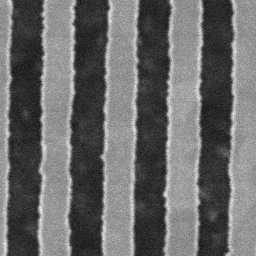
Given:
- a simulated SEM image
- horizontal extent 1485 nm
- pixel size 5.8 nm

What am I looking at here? one or a few lines or trenches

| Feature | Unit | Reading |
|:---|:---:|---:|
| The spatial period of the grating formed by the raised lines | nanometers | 369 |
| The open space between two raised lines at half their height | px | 33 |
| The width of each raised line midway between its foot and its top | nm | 173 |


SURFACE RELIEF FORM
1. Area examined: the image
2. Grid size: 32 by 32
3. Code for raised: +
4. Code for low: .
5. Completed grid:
+....++++.....+++....++++....+++
+....++++.....+++....++++....+++
+.....+++.....+++....++++....+++
+.....+++.....+++....++++....+++
+....++++.....+++....++++....+++
+....++++.....+++....++++....+++
+.....+++....++++....++++....+++
+....++++....++++....++++....+++
+....++++....++++....++++....+++
+....++++....++++....++++....+++
+....++++....++++....++++....+++
+....++++....++++....++++....+++
+....++++....++++....++++....+++
+....++++....++++....++++....+++
+....++++....++++....++++....+++
+....++++....++++....++++....+++
+....++++....++++....++++....+++
+....++++....++++....++++....+++
+....++++....++++....++++....+++
+....++++....++++....++++....+++
+....++++....++++....++++....+++
+....++++....++++....++++....+++
+....++++....++++....++++....+++
+....++++....++++....++++....+++
+....++++....++++....++++....+++
+....++++....++++....++++....+++
+....++++....++++....++++....+++
+....+++.....++++....++++....+++
+....++++....++++....++++....+++
+....++++....++++....++++....+++
+....++++....++++....++++....+++
+....++++....++++....++++....+++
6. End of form